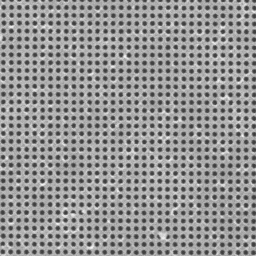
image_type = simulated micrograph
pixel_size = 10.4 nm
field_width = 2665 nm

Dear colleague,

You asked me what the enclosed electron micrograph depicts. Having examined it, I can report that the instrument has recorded a regular array of holes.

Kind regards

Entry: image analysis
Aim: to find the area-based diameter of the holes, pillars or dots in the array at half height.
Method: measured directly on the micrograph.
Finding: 51.2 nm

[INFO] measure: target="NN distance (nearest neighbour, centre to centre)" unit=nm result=78.7